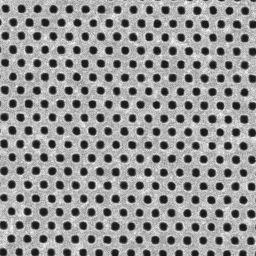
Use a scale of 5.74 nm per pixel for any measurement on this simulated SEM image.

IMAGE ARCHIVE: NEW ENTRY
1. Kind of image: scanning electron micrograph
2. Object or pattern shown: a regular array of holes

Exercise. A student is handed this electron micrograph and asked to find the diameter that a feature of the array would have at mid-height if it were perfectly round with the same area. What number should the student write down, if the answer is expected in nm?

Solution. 48.5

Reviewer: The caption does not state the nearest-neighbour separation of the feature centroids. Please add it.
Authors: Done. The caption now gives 87.7 nm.